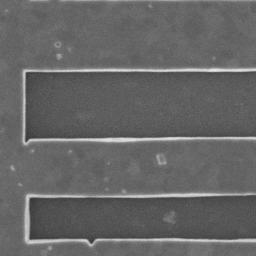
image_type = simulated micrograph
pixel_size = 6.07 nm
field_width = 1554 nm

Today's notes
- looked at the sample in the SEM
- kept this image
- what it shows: one or a few lines or trenches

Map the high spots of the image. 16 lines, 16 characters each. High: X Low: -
XXXXXXXXXXXXXXXX
XXXXXXXXXXXXXXXX
XXXXXXXXXXXXXXXX
XXXXXXXXXXXXXXXX
XX--------------
XX--------------
XX--------------
XX--------------
XX--------------
XXXXXXXXXXXXXXXX
XXXXXXXXXXXXXXXX
XXXXXXXXXXXXXXXX
XX--------------
XX--------------
XX--------------
XXXXXXXXXXXXXXXX